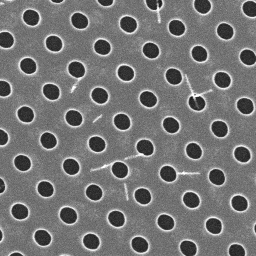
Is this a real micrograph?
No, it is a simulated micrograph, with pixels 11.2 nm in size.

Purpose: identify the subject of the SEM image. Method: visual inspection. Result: a regular array of holes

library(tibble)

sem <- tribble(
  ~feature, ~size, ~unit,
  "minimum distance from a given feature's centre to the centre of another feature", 34.1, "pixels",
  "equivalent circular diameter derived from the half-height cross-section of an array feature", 0.187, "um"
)